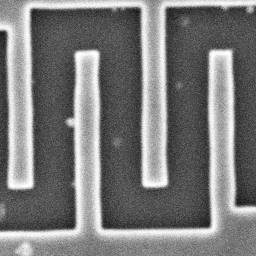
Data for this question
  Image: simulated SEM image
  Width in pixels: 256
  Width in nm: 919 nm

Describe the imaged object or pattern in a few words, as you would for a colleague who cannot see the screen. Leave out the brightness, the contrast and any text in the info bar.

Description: groups of lines, slits or small figures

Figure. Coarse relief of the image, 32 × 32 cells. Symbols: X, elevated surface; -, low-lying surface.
XXXXXXXXXXXXXXXXXXXXXXXXXX-XXXX-
XXXX--------------XX------------
XXX---------------XX------------
XXX---------------XX------------
-XXX--------------XX------------
-XXX--------------XX------------
-XXX--------------XX------------
-XXX------XX------XX------XXX---
-XXX------XX------XX------XXX---
-XXX------XX------XX------XXX---
-XXX------XX------XX------XXX---
-XXX------XX------XX------XXX---
-XXX------XX------XXX-----XXX---
-XXX------XX------XXX-----XXX---
-XXX------XX------XXX-----XXX---
-XXX------XX------XXX-----XXX---
-XXX------XX------XXX-----XXX---
-XXX------XX------XXX-----XXX---
-XXX------XX------XX------XXX---
-XXX------XX------XXX------XX---
-XXX------XX------XXX-----XXX---
-XXX------XX------XXX-----XXX---
-XXX------XX------XXX-----XXX---
----------XX--------------XXX---
----------XX--------------XXX---
----------XX---------------XX---
----------XX---------------XXXXX
----------XX---------------XXXXX
----------XXX-------------XXXXXX
XXXXXXXXXXXXXXXXXXXXXXXXXXXXXXXX
XXXXXXXXXXXXXXXXXXXXXXXXXXXXXXXX
XXXXXXXXXXXXXXXXXXXXXXXXXXXXXXXX